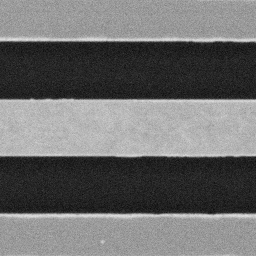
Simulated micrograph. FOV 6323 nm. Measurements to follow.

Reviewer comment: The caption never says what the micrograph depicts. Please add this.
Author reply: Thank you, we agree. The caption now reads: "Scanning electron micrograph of lines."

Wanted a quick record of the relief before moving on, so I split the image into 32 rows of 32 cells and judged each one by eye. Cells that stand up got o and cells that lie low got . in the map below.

oooooooooooooooooooooooooooooooo
oooooooooooooooooooooooooooooooo
oooooooooooooooooooooooooooooooo
oooooooooooooooooooooooooooooooo
oooooooooooooooooooooooooooooooo
................................
................................
................................
................................
................................
................................
................................
................................
oooooooooooooooooooooooooooooooo
oooooooooooooooooooooooooooooooo
oooooooooooooooooooooooooooooooo
oooooooooooooooooooooooooooooooo
oooooooooooooooooooooooooooooooo
oooooooooooooooooooooooooooooooo
...............ooo..............
................................
................................
................................
................................
................................
................................
................................
oooooooooooooooooooooooooooooooo
oooooooooooooooooooooooooooooooo
oooooooooooooooooooooooooooooooo
oooooooooooooooooooooooooooooooo
oooooooooooooooooooooooooooooooo